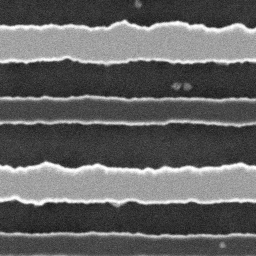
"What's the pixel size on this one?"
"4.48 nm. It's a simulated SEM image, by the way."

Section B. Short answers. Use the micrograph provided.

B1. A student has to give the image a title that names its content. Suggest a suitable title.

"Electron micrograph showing lines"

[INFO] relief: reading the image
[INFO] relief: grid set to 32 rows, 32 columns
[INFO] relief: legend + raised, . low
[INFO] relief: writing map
................................
................................
................................
+++++++++++.++++++++++++++..+++.
++++++++++++++++++++++++++++++++
++++++++++++++++++++++++++++++++
++++++++++++++++++++++++++++++++
+++++++..++++++++.+.++++++++++++
................................
................................
................................
................................
++++++++++++++++++++++++++++++++
++++++++++++++++++++++++++++++++
++++++++++++++++++++++++++++++++
................++.........+++++
................................
................................
................................
................................
.....++.........................
++++++++++++++++++++++++++++++++
++++++++++++++++++++++++++++++++
++++++++++++++++++++++++++++++++
++++++++++++++++++++++++++++++++
....+...........................
................................
................................
................................
++++++++++++++++++++++++++++++++
++++++++++++++++++++++++++++++++
++++++++++++++++++++++++++++++++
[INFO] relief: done